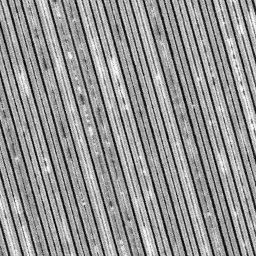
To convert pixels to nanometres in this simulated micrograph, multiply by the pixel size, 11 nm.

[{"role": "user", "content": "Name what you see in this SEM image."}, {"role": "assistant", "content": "parallel lines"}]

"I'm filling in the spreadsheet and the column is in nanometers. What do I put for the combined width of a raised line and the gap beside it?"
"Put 72.2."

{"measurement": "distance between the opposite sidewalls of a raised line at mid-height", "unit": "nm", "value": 53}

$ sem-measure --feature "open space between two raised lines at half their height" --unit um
0.0212